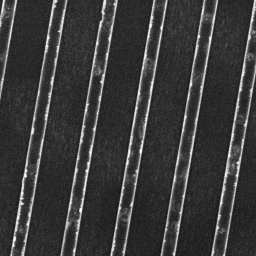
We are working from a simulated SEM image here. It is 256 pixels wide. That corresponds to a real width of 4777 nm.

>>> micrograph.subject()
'parallel lines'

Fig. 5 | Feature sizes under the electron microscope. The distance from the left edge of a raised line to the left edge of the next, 0.923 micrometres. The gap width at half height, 676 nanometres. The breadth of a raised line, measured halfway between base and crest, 237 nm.